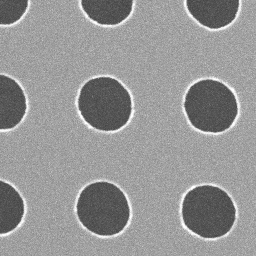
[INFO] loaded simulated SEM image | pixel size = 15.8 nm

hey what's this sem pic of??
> holes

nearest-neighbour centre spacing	1660	nm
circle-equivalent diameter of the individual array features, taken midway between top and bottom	0.854	micrometres